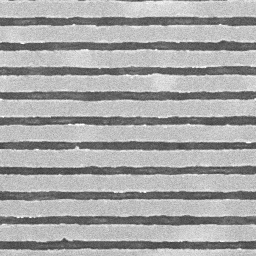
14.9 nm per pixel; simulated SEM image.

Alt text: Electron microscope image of parallel lines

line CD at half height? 237 nm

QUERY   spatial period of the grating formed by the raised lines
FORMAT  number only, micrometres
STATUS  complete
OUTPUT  0.371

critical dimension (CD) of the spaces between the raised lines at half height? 9.25 px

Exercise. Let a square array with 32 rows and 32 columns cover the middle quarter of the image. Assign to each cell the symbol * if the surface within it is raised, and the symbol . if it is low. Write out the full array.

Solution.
.*******************************
................................
................................
********************************
********************************
********************************
********************************
................................
................................
********************************
********************************
********************************
********************************
................................
................................
*******......................***
********************************
********************************
********************************
................................
................................
..**............................
********************************
********************************
********************************
*******.******.*****************
................................
................................
********************************
********************************
********************************
********************************